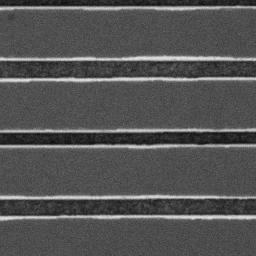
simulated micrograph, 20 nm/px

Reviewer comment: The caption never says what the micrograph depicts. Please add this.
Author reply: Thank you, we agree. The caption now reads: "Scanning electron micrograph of lines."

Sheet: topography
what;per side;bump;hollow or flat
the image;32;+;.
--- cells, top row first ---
................................
++++++++++++++++++++++++++++++++
++++++++++++++++++++++++++++++++
++++++++++++++++++++++++++++++++
++++++++++++++++++++++++++++++++
++++++++++++++++++++++++++++++++
++++++++++++++++++++++++++++++++
................................
................................
................................
++++++++++++++++++++++++++++++++
++++++++++++++++++++++++++++++++
++++++++++++++++++++++++++++++++
++++++++++++++++++++++++++++++++
++++++++++++++++++++++++++++++++
++++++++++++++++++++++++++++++++
+...............................
................................
++++++++++++++++++++++++++++++++
++++++++++++++++++++++++++++++++
++++++++++++++++++++++++++++++++
++++++++++++++++++++++++++++++++
++++++++++++++++++++++++++++++++
++++++++++++++++++++++++++++++++
++++++++++++++++++++++++++++++++
................................
................................
++++++++++++++++++++++++++++++++
++++++++++++++++++++++++++++++++
++++++++++++++++++++++++++++++++
++++++++++++++++++++++++++++++++
++++++++++++++++++++++++++++++++